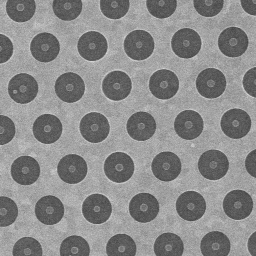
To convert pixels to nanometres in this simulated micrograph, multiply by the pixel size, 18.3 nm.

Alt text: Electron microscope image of an array of small figures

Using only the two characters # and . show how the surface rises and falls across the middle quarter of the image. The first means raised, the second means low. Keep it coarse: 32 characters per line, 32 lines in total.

################################
############..#########....#####
...########.....######......####
.....#####.......####........###
.....####........####........###
.#...####....#...####...##...###
.#...####........####........###
.....#####......######......####
....#######.....#######....#####
...#############################
################################
##############################..
#####.....#######....########...
####.......#####......######....
####.......#####.......####....#
####...#....###....#...####...##
####...#....###........#####....
####.......#####.......#####....
#####......######.....#######...
######...#######################
################################
################################
##.########.....#######.....####
.....#####.......#####.......###
......####........####.......###
......####...#....####...#....##
.##...####...#....####.......###
......####.......#####.......###
.....######......######.....####
....########...#################
################################
################################